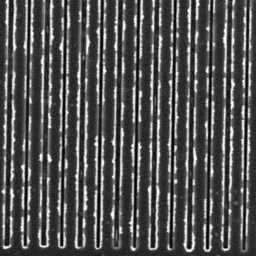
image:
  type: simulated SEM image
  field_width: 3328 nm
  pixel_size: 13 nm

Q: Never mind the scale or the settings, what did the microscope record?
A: parallel lines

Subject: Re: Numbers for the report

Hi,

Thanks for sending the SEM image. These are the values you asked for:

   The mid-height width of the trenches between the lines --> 42.2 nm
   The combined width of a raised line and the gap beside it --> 237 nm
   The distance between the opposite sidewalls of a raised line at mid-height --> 185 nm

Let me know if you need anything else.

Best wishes